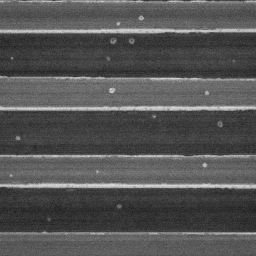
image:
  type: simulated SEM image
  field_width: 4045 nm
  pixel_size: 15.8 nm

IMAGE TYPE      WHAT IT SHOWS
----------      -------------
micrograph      lines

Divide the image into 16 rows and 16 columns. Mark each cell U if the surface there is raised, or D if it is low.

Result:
UUUUUUUUUUUUUUUU
UUUUUUUUUUUUUUUU
DDDDDDDDDDDDDDDD
DDDDDDDDDDDDDDDD
DDDDDDDDDDDDDDDD
UUUUUUUUUUUUUUUU
UUUUUUUUUUUUUUUU
DDDDDDDDDDDDDDDD
DDDDDDDDDDDDDDDD
DDDDDDDDDDDDDDDD
UUUUUUUUUUUUUUUU
UUUUUUUUUUUUUUUU
DDDDDDDDDDDDDDDD
DDDDDDDDDDDDDDDD
DDDDDDDDDDDDDDDD
UUUUUUUUUUUUUUUU